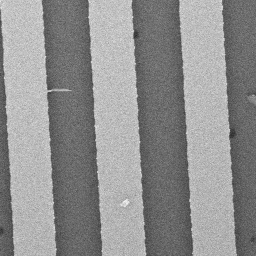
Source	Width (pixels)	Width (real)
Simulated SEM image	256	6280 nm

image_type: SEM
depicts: lines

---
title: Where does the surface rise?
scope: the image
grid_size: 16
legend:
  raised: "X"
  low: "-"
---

XXX---XX---XXX--
XXX---XX---XXX--
XXX---XX---XXX--
XXX---XX---XXX--
XXX---XX---XXX--
XXX---XXX---XX--
XXX---XXX---XX--
XXX---XXX---XX--
XXX---XXX---XX--
-XX---XXX---XX--
-XX---XXX---XX--
-XX---XXX---XXX-
-XX---XXX---XXX-
-XX---XXX---XXX-
-XX---XXX---XXX-
-XX---XXX---XXX-